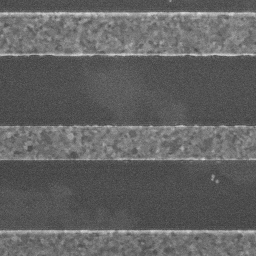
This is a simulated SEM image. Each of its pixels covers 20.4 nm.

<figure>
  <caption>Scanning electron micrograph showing lines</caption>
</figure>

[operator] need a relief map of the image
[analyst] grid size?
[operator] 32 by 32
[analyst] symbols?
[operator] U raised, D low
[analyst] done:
DDDDDDDDDDDDDDDDDDDDDDDDDDDDDDDD
DDDDDDDDDDDDDDDDDDDDDDDDDDDDDDDD
UUUUUUUUUUUUUUUUUUUUUUUUUUUUUUUU
UUUUUUUUUUUUUUUUUUUUUUUUUUUUUUUU
UUUUUUUUUUUUUUUUUUUUUUUUUUUUUUUU
UUUUUUUUUUUUUUUUUUUUUUUUUUUUUUUU
UUUUUUUUUUUUUUUUUUUUUUUUUUUUUUUU
DDDDDDDDDDDDDDDDDDDDDDDDDDDDDDDD
DDDDDDDDDDDDDDDDDDDDDDDDDDDDDDDD
DDDDDDDDDDDDDDDDDDDDDDDDDDDDDDDD
DDDDDDDDDDDDDDDDDDDDDDDDDDDDDDDD
DDDDDDDDDDDDDDDDDDDDDDDDDDDDDDDD
DDDDDDDDDDDDDDDDDDDDDDDDDDDDDDDD
DDDDDDDDDDDDDDDDDDDDDDDDDDDDDDDD
DDDDDDDDDDDDDDDDDDDDDDDDDDDDDDDD
DDDDDDDDDDDDDDDDDDDDDDDDDDDDDDDD
UUUUUUUUUUUUUUUUUUUUUUUUUUUUUUUU
UUUUUUUUUUUUUUUUUUUUUUUUUUUUUUUU
UUUUUUUUUUUUUUUUUUUUUUUUUUUUUUUU
UUUUUUUUUUUUUUUUUUUUUUUUUUUUUUUU
DDDDDDDDDDDDDDDDDDDDDDDDDDDDDDDD
DDDDDDDDDDDDDDDDDDDDDDDDDDDDDDDD
DDDDDDDDDDDDDDDDDDDDDDDDDDDDDDDD
DDDDDDDDDDDDDDDDDDDDDDDDDDDDDDDD
DDDDDDDDDDDDDDDDDDDDDDDDDDDDDDDD
DDDDDDDDDDDDDDDDDDDDDDDDDDDDDDDD
DDDDDDDDDDDDDDDDDDDDDDDDDDDDDDDD
DDDDDDDDDDDDDDDDDDDDDDDDDDDDDDDD
DDDDDDDDDDDDDDDDDDDDDDDDDDDDDDDD
UUUUUUUUUUUUUUUUUUUUUUUUUUUUUUUU
UUUUUUUUUUUUUUUUUUUUUUUUUUUUUUUU
UUUUUUUUUUUUUUUUUUUUUUUUUUUUUUUU